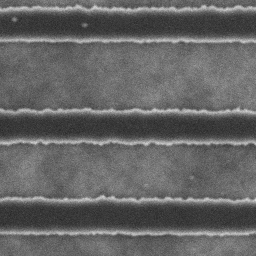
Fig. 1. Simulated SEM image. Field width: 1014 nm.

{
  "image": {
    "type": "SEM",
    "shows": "lines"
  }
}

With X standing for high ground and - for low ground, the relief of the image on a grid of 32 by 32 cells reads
--------------------------------
XXXXXXXXXXXXXXXXXXXXXXXXXXXXXXXX
XXXXXXXXXXXXXXXXXXXXXXXXXXXXXXXX
XXXXXXXXXXXXXXXXXXXXXXXXXXXXXXXX
XXXXXXXXXXXXXXXXXXXXXXXXXXXXXXXX
--------------------------------
--------------------------------
--------------------------------
--------------------------------
--------------------------------
--------------------------------
--------------------------------
--------------------------------
--------------------------------
XXXXXXXXXXXXXXXXXXXXXXXXXXXXXXXX
XXXXXXXXXXXXXXXXXXXXXXXXXXXXXXXX
XXXXXXXXXXXXXXXXXXXXXXXXXXXXXXXX
XXXXXXXXXXXXXXXXXXXXXXXXXXXXXXXX
--------------------------------
--------------------------------
--------------------------------
--------------------------------
--------------------------------
--------------------------------
--------------------------------
XXXXXXXXXXXXXXXXXXXXXXXXXXXXXXXX
XXXXXXXXXXXXXXXXXXXXXXXXXXXXXXXX
XXXXXXXXXXXXXXXXXXXXXXXXXXXXXXXX
XXXXXXXXXXXXXXXXXXXXXXXXXXXXXXXX
--------------------------------
--------------------------------
--------------------------------